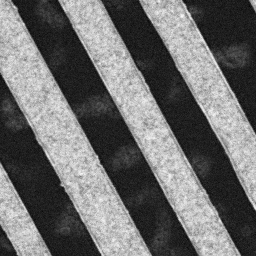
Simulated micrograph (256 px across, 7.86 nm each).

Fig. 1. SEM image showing one or a few lines or trenches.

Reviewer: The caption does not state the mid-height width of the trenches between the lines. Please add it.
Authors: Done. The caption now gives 331 nanometres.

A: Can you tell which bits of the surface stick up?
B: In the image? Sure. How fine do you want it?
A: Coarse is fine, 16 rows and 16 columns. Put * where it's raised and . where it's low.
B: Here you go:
*...***..***....
*....**...**....
**...***..***...
***...**...**...
***...***..***..
.***...**...**..
.***...***..***.
..***...**...**.
..***...***...**
...***...**...**
...***...***...*
*...***...***..*
*...****...**...
**...***...***..
**....***...**..
.**...***...***.